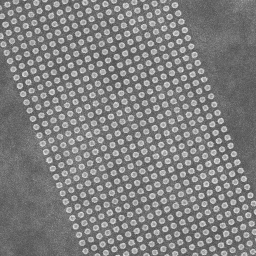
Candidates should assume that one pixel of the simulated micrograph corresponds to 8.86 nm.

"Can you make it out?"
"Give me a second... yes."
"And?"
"a regular array of raised bodies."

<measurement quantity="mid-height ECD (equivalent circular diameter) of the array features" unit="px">5.64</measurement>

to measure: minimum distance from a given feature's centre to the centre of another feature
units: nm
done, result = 77.5